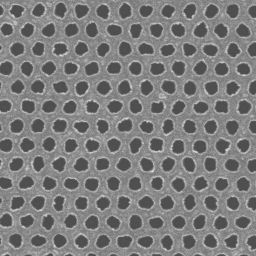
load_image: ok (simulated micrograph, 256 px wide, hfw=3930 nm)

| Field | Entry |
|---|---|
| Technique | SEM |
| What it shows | a regular array of holes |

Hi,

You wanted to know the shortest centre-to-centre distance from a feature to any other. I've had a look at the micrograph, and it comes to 0.323 µm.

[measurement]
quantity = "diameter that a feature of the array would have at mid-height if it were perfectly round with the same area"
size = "194 nm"